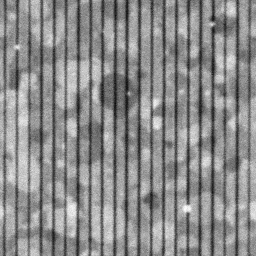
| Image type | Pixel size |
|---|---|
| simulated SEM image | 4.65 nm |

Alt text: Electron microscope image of parallel lines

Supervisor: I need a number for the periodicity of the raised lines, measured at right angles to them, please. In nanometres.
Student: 57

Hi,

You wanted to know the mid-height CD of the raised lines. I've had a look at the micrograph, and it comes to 45.9 nanometers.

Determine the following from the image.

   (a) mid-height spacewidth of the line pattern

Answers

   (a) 12.8 nanometres